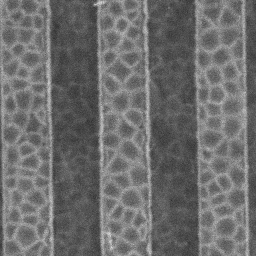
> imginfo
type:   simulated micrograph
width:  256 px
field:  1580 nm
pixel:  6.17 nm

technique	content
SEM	one or a few lines or trenches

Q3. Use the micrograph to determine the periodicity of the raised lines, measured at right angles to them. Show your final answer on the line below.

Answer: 0.603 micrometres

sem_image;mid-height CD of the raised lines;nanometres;295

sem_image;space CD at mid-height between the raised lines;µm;0.307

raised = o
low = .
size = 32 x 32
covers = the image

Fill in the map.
oooooo......oooooo.......ooooo..
oooooo......oooooo.......ooooo..
oooooo......oooooo.......oooooo.
oooooo......oooooo.......oooooo.
oooooo......oooooo.......oooooo.
oooooo......oooooo.......oooooo.
oooooo......oooooo.......oooooo.
oooooo.......ooooo.......oooooo.
oooooo......ooooooo......oooooo.
oooooo.......oooooo......oooooo.
oooooo.......oooooo......oooooo.
oooooo.......oooooo......oooooo.
oooooo.......oooooo......oooooo.
oooooo.......oooooo......oooooo.
oooooo.......ooooo.......oooooo.
oooooo.......oooooo......oooooo.
oooooo.......oooooo......oooooo.
oooooo.......oooooo......oooooo.
oooooo.......oooooo......oooooo.
oooooo.......oooooo......oooooo.
oooooo.......oooooo......oooooo.
oooooo.......oooooo......oooooo.
oooooo.......oooooo......oooooo.
oooooo.......oooooo......oooooo.
oooooo.......oooooo......oooooo.
oooooo.......oooooo......oooooo.
oooooo.......oooooo......oooooo.
.ooooo.......oooooo......oooooo.
.oooooo......oooooo......oooooo.
.oooooo......oooooo......oooooo.
.oooooo......oooooo......oooooo.
.oooooo......oooooo......oooooo.